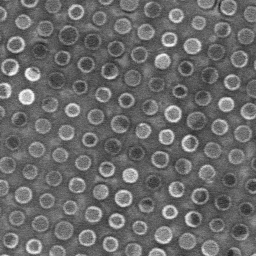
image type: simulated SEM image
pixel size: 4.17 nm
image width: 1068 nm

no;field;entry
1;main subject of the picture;a regular array of raised bodies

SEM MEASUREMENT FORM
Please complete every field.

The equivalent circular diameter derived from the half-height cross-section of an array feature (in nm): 63.4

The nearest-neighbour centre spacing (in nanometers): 97.8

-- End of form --